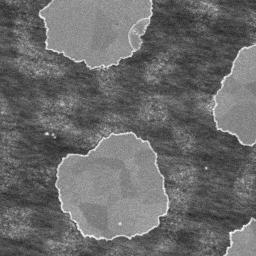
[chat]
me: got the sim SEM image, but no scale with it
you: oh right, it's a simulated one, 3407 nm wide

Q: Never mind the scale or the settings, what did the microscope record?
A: raised bodies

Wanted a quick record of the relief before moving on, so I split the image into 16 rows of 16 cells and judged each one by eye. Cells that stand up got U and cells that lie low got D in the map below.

DDDUUUUUUDDDDDDD
DDDUUUUUUDDDDDDD
DDDUUUUUDDDDDDDD
DDDDUUUUDDDDDDDU
DDDDDDDDDDDDDDUU
DDDDDDDDDDDDDDUU
DDDDDDDDDDDDDUUU
DDDDDDDDDDDDDUUU
DDDDDDDUDDDDDDDU
DDDDDUUUUUDDDDDD
DDDDUUUUUUDDDDDD
DDDDUUUUUUDDDDDD
DDDDUUUUUUDDDDDD
DDDDUUUUUUDDDDDD
DDDDDUUUUDDDDDDU
DDDDDDDDDDDDDDUU